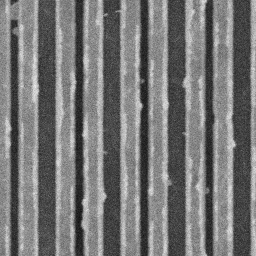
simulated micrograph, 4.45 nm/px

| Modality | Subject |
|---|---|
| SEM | parallel lines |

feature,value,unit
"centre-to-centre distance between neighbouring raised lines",0.145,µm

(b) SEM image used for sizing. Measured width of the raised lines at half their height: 75.1 nanometers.